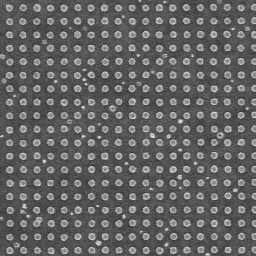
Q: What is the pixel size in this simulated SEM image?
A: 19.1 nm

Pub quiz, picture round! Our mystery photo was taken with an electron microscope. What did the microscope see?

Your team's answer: a regular array of raised bodies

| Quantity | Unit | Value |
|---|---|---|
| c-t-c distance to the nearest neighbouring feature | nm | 249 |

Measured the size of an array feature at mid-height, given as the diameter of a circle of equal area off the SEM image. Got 120 nm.